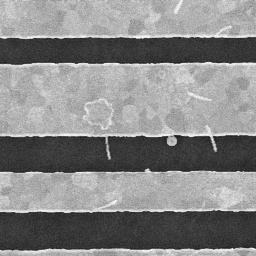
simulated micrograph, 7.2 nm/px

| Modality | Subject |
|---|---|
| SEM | lines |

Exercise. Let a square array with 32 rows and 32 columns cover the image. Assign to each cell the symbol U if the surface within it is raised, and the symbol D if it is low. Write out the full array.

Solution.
UUUUUUUUUUUUUUUUUUUUUUUUUUUUUUUU
UUUUUUUUUUUUUUUUUUUUUUUUUUUUUUUU
UUUUUUUUUUUUUUUUUUUUUUUUUUUUUUUU
UUUUUUUUUUUUUUUUUUUUUUUUUUUUUUUU
UUUUUUUUUUUUUUUUUUUUUUUUUUUUUUUU
DDDDDDDDDDDDDDDDDDDDDDDDDDDDDDDD
DDDDDDDDDDDDDDDDDDDDDDDDDDDDDDDD
DDDDDDDDDDDDDDDDDDDDDDDDDDDDDDDD
UUUUUUUUUUUUUUUUUUUUUUUUUUUUUUUU
UUUUUUUUUUUUUUUUUUUUUUUUUUUUUUUU
UUUUUUUUUUUUUUUUUUUUUUUUUUUUUUUU
UUUUUUUUUUUUUUUUUUUUUUUUUUUUUUUU
UUUUUUUUUUUUUUUUUUUUUUUUUUUUUUUU
UUUUUUUUUUUUUUUUUUUUUUUUUUUUUUUU
UUUUUUUUUUUUUUUUUUUUUUUUUUUUUUUU
UUUUUUUUUUUUUUUUUUUUUUUUUUUUUUUU
UUUUUUUUUUUUUUUUUUUUUUUUUUUUUUUU
DDDDDDDDDDDDDDDDDDDDDUDDDDDDDDDD
DDDDDDDDDDDDDDDDDDDDDDDDDDDDDDDD
DDDDDDDDDDDDDDDDDDDDDDDDDDDDDDDD
DDDDDDDDDDDDDDDDDDDDDDDDDDDDDDDD
DDDDDDDDDDDDDDDDDDUDDUUDUUUDDDDD
UUUUUUUUUUUUUUUUUUUUUUUUUUUUUUUU
UUUUUUUUUUUUUUUUUUUUUUUUUUUUUUUU
UUUUUUUUUUUUUUUUUUUUUUUUUUUUUUUU
UUUUUUUUUUUUUUUUUUUUUUUUUUUUUUUU
DDDDDDDDDDDDDDDDDDDDDDDDDDDDDDDD
DDDDDDDDDDDDDDDDDDDDDDDDDDDDDDDD
DDDDDDDDDDDDDDDDDDDDDDDDDDDDDDDD
DDDDDDDDDDDDDDDDDDDDDDDDDDDDDDDD
DDDDDDDDDDDDDDDDDDDDDDDDDDDDDDDD
UUUUUUUUUUUUUUUUUUUUUUUUUUUUUUUU